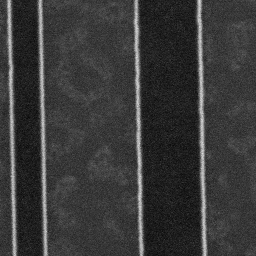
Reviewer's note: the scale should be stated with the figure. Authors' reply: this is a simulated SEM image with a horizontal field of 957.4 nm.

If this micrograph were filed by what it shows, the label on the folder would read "one or a few lines or trenches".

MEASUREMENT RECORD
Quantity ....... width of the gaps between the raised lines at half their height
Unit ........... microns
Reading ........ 0.354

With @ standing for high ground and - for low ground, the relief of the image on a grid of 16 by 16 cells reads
-@@-----@@@@----
-@@-----@@@@@---
-@@-----@@@@@---
-@@------@@@@---
-@@------@@@@---
-@@------@@@@---
-@@------@@@@---
-@@------@@@@---
-@@------@@@@---
-@@------@@@@---
-@@------@@@@---
-@@------@@@@---
-@@------@@@@---
-@@------@@@@---
-@@------@@@@---
-@@------@@@@---